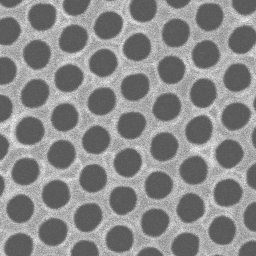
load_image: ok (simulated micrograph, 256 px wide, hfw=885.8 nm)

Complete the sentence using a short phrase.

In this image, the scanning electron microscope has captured a regular array of holes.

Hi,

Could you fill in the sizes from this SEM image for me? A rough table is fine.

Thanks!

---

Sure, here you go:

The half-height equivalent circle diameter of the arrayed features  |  0.0965 microns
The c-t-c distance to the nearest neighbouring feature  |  130 nm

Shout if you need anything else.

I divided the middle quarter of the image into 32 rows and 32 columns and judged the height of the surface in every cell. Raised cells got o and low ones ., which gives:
...ooo.......oooooooooo.......oo
....ooo......oooooooooo.......oo
.....oo.....oooooo..oooo......oo
.....oooooooooo......ooo......oo
.....ooooooooo.......oooo....ooo
....oooooooooo.......ooooooooooo
...ooooo....oo.......ooooooooooo
ooooooo......o.......oooo..ooooo
oooooo.......oo.....ooo......ooo
oooooo.......oooooooooo......ooo
..oooo.......ooooooooo.......ooo
...ooo......oooooooooo.......ooo
....oooo...oooo....ooo.......ooo
....oooooooooo......ooo.....oooo
...ooooooooooo.......oooooooooo.
...oooo..oooo.......ooooooooooo.
.ooooo.....oo.......oooooooooo..
ooooo......ooo.....ooooo...ooo..
ooooo.......ooo...oooo......ooo.
.ooo........oooooooooo......oooo
..ooo......ooooooooooo.......ooo
...oo.....ooooo...oooo......oooo
...oooo.ooooo......ooo......oooo
...oooooooooo......ooo.....oooo.
..oooooooooo.......ooooooooooo..
.ooooo...oooo......oooooooooo...
ooooo.....ooo......oooooooooo...
oooo.......ooo....oooo....ooo...
oooo.......oooooooooo......oo...
oooo.......ooooooooo.......oooo.
.ooo......oooooooooo.......ooooo
.oooo....ooo.....ooo.......ooooo